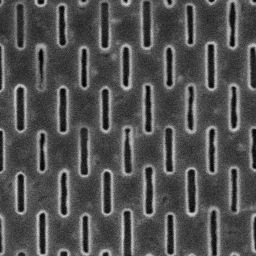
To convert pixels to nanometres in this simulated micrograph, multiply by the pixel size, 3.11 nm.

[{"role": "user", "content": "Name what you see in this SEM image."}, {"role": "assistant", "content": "a regular array of holes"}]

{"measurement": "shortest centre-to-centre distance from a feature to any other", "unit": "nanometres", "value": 131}